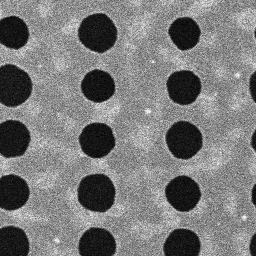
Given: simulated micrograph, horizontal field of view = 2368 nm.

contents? a regular array of holes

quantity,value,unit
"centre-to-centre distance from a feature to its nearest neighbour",0.489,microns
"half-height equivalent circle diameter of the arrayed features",329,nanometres